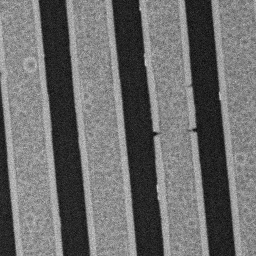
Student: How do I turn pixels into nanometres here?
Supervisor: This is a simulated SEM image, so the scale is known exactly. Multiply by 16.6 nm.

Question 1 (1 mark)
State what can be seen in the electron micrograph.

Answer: one or a few lines or trenches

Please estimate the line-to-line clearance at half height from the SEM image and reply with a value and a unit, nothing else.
567 nm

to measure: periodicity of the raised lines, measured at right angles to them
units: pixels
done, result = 73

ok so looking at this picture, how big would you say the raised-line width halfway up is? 640 nm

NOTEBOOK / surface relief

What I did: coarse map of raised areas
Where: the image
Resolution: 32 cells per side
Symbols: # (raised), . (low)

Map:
####.....#####....#####....#####
####.....#####....#####....#####
#####....#####....#####....#####
#####....#####....#####....#####
#####....#####....#####....#####
#####....#####....#####....#####
#####....#####.....####....#####
#####....#####.....####.....####
#####....#####.....####.....####
.####....#####.....####.....####
.####.....####.....####.....####
.####.....#####....#####....####
.#####....#####....#####....####
.#####....#####....#####....####
.#####....#####....#####....####
.#####....#####....#####....####
.#####....#####.....####....####
.#####....#####.....####.....###
.#####....#####.....####.....###
.#####.....####.....####.....###
.#####.....#####....####.....###
.#####.....#####....#####....###
..#####....#####....#####....###
..#####....#####....#####....###
..#####....#####....#####....###
..#####....#####....#####....###
..#####....#####.....####....###
..#####....#####.....####.....##
..#####....#####.....####.....##
..#####.....####.....####.....##
..#####.....#####....#####....##
..#####.....#####....#####....##